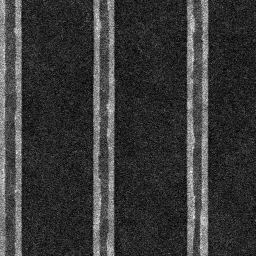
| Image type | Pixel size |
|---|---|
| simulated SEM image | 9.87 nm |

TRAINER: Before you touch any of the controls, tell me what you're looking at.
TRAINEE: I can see one or a few lines or trenches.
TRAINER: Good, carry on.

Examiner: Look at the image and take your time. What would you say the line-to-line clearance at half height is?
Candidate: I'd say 758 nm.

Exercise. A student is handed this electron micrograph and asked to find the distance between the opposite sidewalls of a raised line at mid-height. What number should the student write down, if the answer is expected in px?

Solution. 16.7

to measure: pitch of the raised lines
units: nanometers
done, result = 923